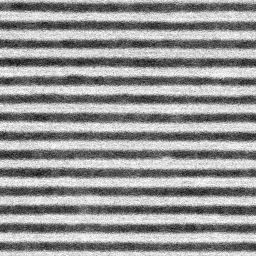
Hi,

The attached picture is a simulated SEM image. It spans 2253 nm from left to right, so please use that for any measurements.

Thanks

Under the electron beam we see parallel lines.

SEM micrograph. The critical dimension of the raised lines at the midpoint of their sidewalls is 5.5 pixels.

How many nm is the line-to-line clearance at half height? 111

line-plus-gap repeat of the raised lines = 162 nanometers